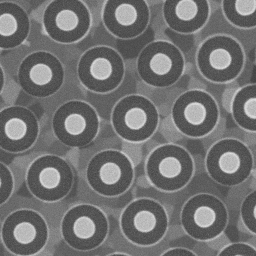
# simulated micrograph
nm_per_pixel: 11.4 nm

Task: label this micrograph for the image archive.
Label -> an array of small figures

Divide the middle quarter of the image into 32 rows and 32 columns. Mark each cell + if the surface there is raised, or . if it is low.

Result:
+++....+++++...+++....+++++...++
+++....+++++...+++....++++....++
+++....++++....++++.....+.....++
++++....++.....++++..........+++
++++..........++++++........++++
+++++.........++++++++....++++++
+++++++......+++++++++++++++++++
+++++++++++++++++++++++++++++...
+++++++++++++++......+++++++....
+....++++++++.........++++++....
.......++++++..........++++....+
........++++.....++....++++...++
........++++....++++...++++...++
.++++....+++....++++....+++....+
+++++....+++....++++....+++.....
.++++....+++....++++...+++++....
.++++....++++..........++++++...
........+++++.........++++++++..
........+++++++......+++++++++++
.......++++++++++..+++++++++++++
+....+++++++++++++++++++.....+++
+++++++++++..+++++++++........++
++++++++.......+++++++.........+
+++++++.........+++++...........
.+++++...........++++....++++...
.+++++....+++....+++....+++++...
..++++...+++++...+++....+++++...
..++++...+++++....+++....+++....
..++++...+++++...++++...........
..++++....+++....+++++.........+
..+++++..........++++++.......++
..+++++.........++++++++....++++